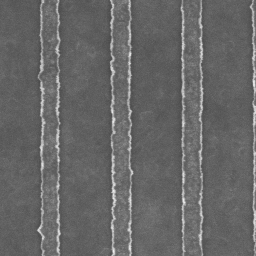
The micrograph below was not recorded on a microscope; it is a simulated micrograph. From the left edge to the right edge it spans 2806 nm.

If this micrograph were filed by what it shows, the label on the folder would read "one or a few lines or trenches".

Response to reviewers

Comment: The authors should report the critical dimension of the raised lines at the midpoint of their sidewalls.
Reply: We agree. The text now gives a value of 205 nm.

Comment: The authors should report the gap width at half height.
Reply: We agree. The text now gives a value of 573 nanometres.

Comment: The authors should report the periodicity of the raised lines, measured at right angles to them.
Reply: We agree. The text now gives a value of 778 nm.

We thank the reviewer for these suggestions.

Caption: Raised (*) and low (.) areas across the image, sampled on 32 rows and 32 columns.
.....**.......**.......**......*
.....**.......**.......**.......
.....**.......**.......**.......
.....**.......**.......**.......
.....**.......**.......**.......
.....**.......**.......**.......
.....**.......**.......**.......
.....**.......**.......**.......
.....**.......**.......**.......
.....**.......**.......**.......
.....**.......**.......**.......
.....**.......**.......**.......
.....**.......**.......**.......
.....**.......**.......**.......
.....**.......**.......**.......
.....**.......**.......**.......
.....**.......**.......**.......
.....**.......**.......**.......
.....**.......**.......**.......
.....**.......**.......**.......
.....**.......**.......**.......
.....**.......**.......**.......
.....**.......**.......**.......
.....**.......**.......**.......
.....**.......**.......**.......
.....**.......**.......**.......
.....**.......**.......**.......
.....**.......**.......**.......
.....**.......**.......**.......
.....**.......**.......**.......
.....**.......**.......**.......
.....**.......**.......**.......